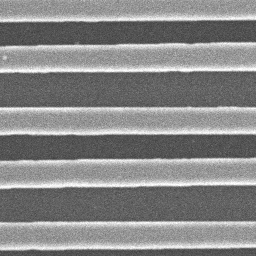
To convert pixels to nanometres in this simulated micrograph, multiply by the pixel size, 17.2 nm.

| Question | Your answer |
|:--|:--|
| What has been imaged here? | lines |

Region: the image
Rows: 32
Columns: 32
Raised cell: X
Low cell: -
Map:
XXXXXXXXXXXXXXXXXXXXXXXXXXXXXXXX
XXXXXXXXXXXXXXXXXXXXXXXXXXXXXXXX
XXXXXXXXXXXXXXXXXXXXXX----------
--------------------------------
--------------------------------
--------------------XXXXXXXXXXXX
XXXXXXXXXXXXXXXXXXXXXXXXXXXXXXXX
XXXXXXXXXXXXXXXXXXXXXXXXXXXXXXXX
XXXXXXXXXXXXXXXXXXXXXXXXXXXXXXXX
--------------------------------
--------------------------------
--------------------------------
--------------------------------
-----------------------X---XXX--
XXXXXXXXXXXXXXXXXXXXXXXXXXXXXXXX
XXXXXXXXXXXXXXXXXXXXXXXXXXXXXXXX
XXXXXXXXXXXXXXXXXXXXXXXXXXXXXXXX
--------------------------------
--------------------------------
--------------------------------
XXXXXXXXXXXXXXXXXXXXXXXXXXXXXXXX
XXXXXXXXXXXXXXXXXXXXXXXXXXXXXXXX
XXXXXXXXXXXXXXXXXXXXXXXXXXXXXXXX
X-------------------------------
--------------------------------
--------------------------------
--------------------------------
--------------------------------
XXXXXXXXXXXXXXXXXXXXXXXXXXXXXXXX
XXXXXXXXXXXXXXXXXXXXXXXXXXXXXXXX
XXXXXXXXXXXXXXXXXXXXXXXXXXXXXXXX
--------------------------------